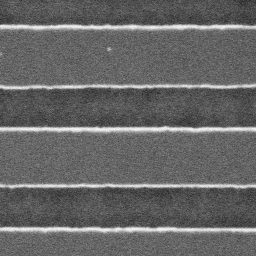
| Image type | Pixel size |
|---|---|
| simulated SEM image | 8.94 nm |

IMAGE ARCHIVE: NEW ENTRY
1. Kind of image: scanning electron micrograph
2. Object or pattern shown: lines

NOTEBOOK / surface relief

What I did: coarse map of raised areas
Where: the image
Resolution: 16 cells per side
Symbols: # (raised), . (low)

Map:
................
................
################
################
################
##.#............
................
................
################
################
################
################
................
................
################
################